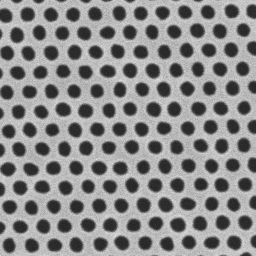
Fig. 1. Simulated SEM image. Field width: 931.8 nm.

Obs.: a regular array of holes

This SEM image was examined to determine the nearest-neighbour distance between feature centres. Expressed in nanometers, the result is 78.3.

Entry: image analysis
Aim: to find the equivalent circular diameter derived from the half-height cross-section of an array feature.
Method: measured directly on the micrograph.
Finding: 53.3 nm